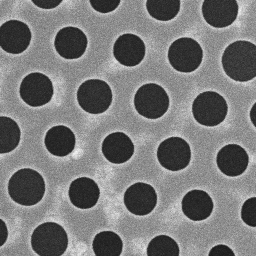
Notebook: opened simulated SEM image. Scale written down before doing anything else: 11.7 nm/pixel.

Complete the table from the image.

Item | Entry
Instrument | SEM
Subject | a regular array of holes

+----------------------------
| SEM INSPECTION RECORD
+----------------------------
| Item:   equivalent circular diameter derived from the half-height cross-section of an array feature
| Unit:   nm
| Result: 393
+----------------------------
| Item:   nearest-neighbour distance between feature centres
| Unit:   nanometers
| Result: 660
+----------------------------